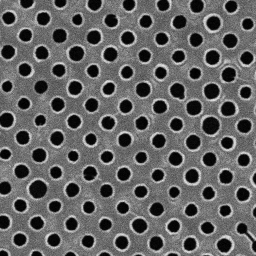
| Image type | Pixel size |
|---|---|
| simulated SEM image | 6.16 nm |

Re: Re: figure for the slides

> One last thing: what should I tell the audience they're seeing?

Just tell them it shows a regular array of holes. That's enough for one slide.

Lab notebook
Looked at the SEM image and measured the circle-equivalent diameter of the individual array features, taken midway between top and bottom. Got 79.3 nm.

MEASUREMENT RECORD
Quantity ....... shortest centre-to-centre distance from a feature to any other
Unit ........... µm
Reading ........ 0.147